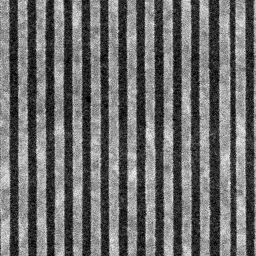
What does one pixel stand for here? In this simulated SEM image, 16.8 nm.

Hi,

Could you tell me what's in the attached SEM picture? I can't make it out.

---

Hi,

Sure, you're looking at parallel lines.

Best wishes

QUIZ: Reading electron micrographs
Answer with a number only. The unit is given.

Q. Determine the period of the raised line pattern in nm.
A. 305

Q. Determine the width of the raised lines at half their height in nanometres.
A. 147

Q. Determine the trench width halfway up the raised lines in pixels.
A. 9.62